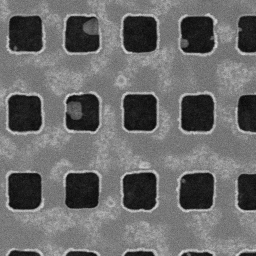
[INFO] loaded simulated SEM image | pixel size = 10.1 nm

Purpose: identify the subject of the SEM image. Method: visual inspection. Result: a regular array of holes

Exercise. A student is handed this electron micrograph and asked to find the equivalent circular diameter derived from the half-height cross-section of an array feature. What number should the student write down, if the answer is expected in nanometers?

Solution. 391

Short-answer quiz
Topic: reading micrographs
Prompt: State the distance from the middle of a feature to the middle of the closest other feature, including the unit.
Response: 580 nm